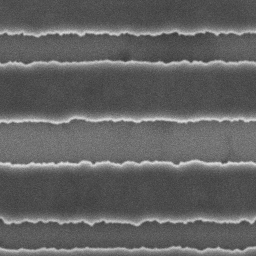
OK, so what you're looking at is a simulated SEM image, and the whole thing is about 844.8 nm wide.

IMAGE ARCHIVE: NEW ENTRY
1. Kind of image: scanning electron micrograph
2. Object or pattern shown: lines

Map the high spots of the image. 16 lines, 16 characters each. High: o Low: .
oooooooooooooooo
oooooooooooooooo
................
................
oooooooooooooooo
oooooooooooooooo
oooooooooooooooo
oooooooooooooo.o
................
................
oooooooooooooooo
oooooooooooooooo
oooooooooooooooo
oooooooooooooooo
................
...........o....